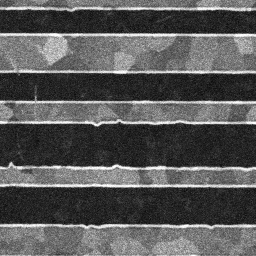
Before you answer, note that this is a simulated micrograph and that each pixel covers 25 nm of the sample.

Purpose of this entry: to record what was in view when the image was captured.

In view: one or a few lines or trenches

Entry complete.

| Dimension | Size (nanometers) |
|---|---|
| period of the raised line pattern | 1540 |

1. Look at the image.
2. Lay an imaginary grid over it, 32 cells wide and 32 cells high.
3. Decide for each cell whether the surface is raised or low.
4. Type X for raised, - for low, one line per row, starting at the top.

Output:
XXXXXXXXXXXXXXXXXXXXXXXXXXXXXXXX
--------------------------------
--------------------------------
--------------------------------
XXXXXXXXXXXXXXXXXXXXXXXXXXXXXXXX
XXXXXXXXXXXXXXXXXXXXXXXXXXXXXXXX
XXXXXXXXXXXXXXXXXXXXXXXXXXXXXXXX
XXXXXXXXXXXXXXXXXXXXXXXXXXXXXXXX
XXXXXXXXXXXXXXXXXXXXXXXXXXXXXXXX
--------------------------------
--------------------------------
--------------------------------
--------------------------------
XXXXXXXXXXXXXXXXXXXXXXXXXXXXXXXX
XXXXXXXXXXXXXXXXXXXXXXXXXXXXXXXX
--------------------------------
--------------------------------
--------------------------------
--------------------------------
--------------------------------
--------------------------------
XXXXXXXXXXXXXXXXXXXXXXXXXXXXXXXX
XXXXXXXXXXXXXXXXXXXXXXXXXXXXXXXX
--------------------------------
--------------------------------
--------------------------------
--------------------------------
--------------------------------
XXXXXXXXXXXXXXXXXXXXXXXXXXXXXXXX
XXXXXXXXXXXXXXXXXXXXXXXXXXXXXXXX
XXXXXXXXXXXXXXXXXXXXXXXXXXXXXXXX
XXXXXXXXXXXXXXXXXXXXXXXXXXXXXXXX